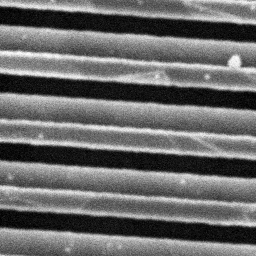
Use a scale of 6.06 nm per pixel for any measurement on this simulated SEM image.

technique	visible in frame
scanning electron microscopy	lines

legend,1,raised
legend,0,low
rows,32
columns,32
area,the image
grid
11111111111111111111111111111111
00000000000111111111111111111111
00000000000000000000000001111111
11111000000000000000000000000000
11111111111111111110000000000000
11111111111111111111111111111111
11111111111111111111111111111111
11111111111111111111111111111111
11111111111111111111111111111111
00000011111111111111111111111111
00000000000000000001111111111111
00000000000000000000000000000000
11111111111100000000000000000000
11111111111111111111111111000000
11111111111111111111111111111111
11111111111111111111111111111111
11111111111111111111111111111111
11111111111111111111111111111111
00000000000111111111111111111111
00000000000000000000000000001111
11111000000000000000000000000000
11111111111111111100000000000000
11111111111111111111111111111111
11111111111111111111111111111111
11111111111111111111111111111111
11111111111111111111111111111111
00000001111111111111111111111111
00000000000000000000001111111111
00000000000000000000000000000000
11111111111111000000000000000000
11111111111111111111111111100000
11111111111111111111111111111111